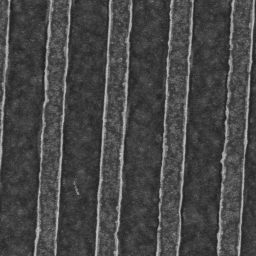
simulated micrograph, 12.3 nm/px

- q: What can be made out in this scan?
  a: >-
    one or a few lines or trenches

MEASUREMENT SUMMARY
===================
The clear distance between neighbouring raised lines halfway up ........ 0.501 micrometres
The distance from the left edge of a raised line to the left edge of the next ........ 753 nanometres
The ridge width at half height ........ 251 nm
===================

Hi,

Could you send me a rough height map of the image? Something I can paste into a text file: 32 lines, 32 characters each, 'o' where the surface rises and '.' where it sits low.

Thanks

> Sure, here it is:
o.....ooo.....oo.....ooo.....ooo
o.....ooo.....oo.....ooo.....ooo
o.....ooo.....oo.....ooo.....ooo
o.....ooo.....oo.....ooo.....ooo
o.....oo......oo.....ooo.....oo.
o.....oo......oo.....ooo.....oo.
o.....oo......oo.....ooo.....oo.
o.....oo.....ooo.....ooo.....oo.
o.....oo.....ooo.....ooo.....oo.
o.....oo.....ooo.....ooo.....oo.
o.....oo.....ooo.....ooo....ooo.
o.....oo.....ooo.....oo......oo.
......oo.....ooo.....oo.....ooo.
......oo.....ooo.....oo.....ooo.
.....ooo.....ooo.....oo.....ooo.
.....ooo.....ooo.....oo.....ooo.
.....ooo.....oo......oo.....ooo.
.....ooo.....oo.....ooo.....ooo.
.....ooo.....oo.....ooo.....ooo.
.....ooo.....oo.....ooo.....ooo.
.....ooo.....oo.....ooo.....oo..
.....oo......oo.....ooo.....oo..
.....oo......oo.....ooo.....oo..
.....oo.....ooo.....ooo.....oo..
.....oo.....ooo.....ooo.....oo..
.....oo.....ooo.....ooo.....oo..
.....oo.....ooo.....ooo....ooo..
.....oo.....ooo.....ooo.....oo..
.....oo.....ooo.....ooo....ooo..
.....oo.....ooo.....oo.....ooo..
....ooo.....ooo.....oo.....ooo..
....ooo.....ooo.....oo.....ooo..